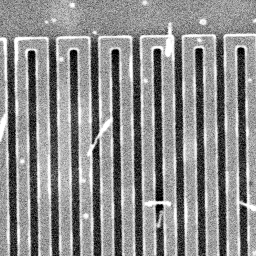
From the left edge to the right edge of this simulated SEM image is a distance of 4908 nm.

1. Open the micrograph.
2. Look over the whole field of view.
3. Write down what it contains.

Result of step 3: groups of lines, slits or small figures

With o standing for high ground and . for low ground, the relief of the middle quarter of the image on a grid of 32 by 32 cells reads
o...oo...ooo..ooo..ooo..ooo...oo
o...oo...ooo..ooo...oo...oo...oo
o...ooo..ooo..ooo...oo...oo...oo
o...ooo..ooo..ooo...oo...ooo..oo
o...ooo..ooo..ooo...oo...ooo..oo
o...ooo..ooo..ooo...oo...ooo..oo
o...ooo..ooo..ooo...oo...ooo..oo
o...ooo..ooo..ooo...oo...ooo..oo
o...ooo..ooo..ooo...oo...ooo..oo
o...ooo..ooo..ooo...oo...ooo..oo
o...ooo..ooo..ooo...oo...ooo..oo
o...ooo..ooo..ooo...oo...ooo..oo
o...ooo..ooo..ooo...oo...ooo..oo
o...ooo..ooo..ooo...oo...ooo..oo
o...ooo..ooo..ooo...oo...ooo..oo
o...ooo..ooo..ooo...oo...ooo..oo
o...ooo..ooo..ooo...oo...ooo..oo
o...ooo..ooo..ooo...oo...ooo..oo
o...ooo..ooo..ooo...oo...ooo..oo
o...ooo..ooo..ooo...oo...ooo..oo
o...ooo..ooo..ooo...oo...ooo..oo
o...ooo..ooo..ooo...oo...ooo..oo
oo..ooo..ooo..ooo...oo...ooo..oo
oo..ooo..ooo..ooo...ooo..ooo..oo
oo..ooo..ooo...oo...ooo..ooo..oo
oo..ooo..ooo...oo...ooo..ooo..oo
oo..ooo..ooo...oo...ooo..ooo..oo
oo..ooo..ooo...oo...ooo..ooo..oo
oo..ooo..ooo...oo...ooo..ooo..oo
oo..ooo..ooo...oo...ooo..ooo..oo
oo..ooo..ooo...oo...ooo..ooo..oo
oo..ooo..ooo...oo...ooo..ooo..oo